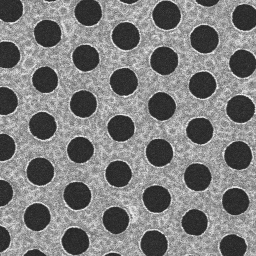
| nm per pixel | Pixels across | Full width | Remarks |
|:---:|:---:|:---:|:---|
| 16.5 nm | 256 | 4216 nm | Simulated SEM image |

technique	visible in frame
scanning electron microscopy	a regular array of holes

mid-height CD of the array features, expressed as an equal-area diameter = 0.456 micrometres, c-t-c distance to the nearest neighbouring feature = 743 nanometres